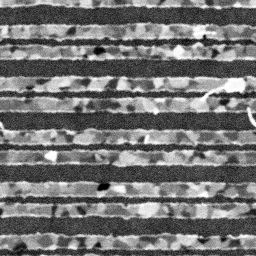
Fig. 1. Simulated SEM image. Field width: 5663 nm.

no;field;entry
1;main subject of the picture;parallel lines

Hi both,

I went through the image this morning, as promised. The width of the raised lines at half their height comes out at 290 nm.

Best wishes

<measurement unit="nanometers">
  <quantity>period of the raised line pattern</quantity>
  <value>582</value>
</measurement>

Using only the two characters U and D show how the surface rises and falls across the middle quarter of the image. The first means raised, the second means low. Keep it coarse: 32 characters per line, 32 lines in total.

DDDDDDDDDDDDDDDDDDDDDDDDDDDDDDDD
DDDDDDDDDDDDDDDDDDDDDDDDDDDDDDDD
DDDDDDDDDDDDDDDDDDDDDDDDDDDDDDDD
UUUUUUUDDDUUDUDDDDDDDDDDDDDDDDDD
UUUUUUUUUUUUUUUUUUUUUUUUUUUUUUUU
UUUUUUUUUUUUUUUUUUUUUUUUUUUUUUUU
UUUUUUDUUUDDUDDDUUUUUUUUDDUUUUUU
DDDDDDDDDDDDDDDDDDDDDDDDDDDDDDDD
DDDDDDDDDDDDDDDDDDDDDDDDDDDDDDDD
UUUUUUUUUUUUUUUUUUUUUUUUUUUUUUUU
UUUUUUUUUUUUUUUUUUUUUUUUUUUUUUUU
UUUUUUUUUUUUUUUUUUUUUUUUUUUUUUUU
DDDDDDDDDDDDDDDDDDDDDDDDDDDDDDDD
DDDDDDDDDDDDDDDDDDDDDDDDDDDDDDDD
DDDDDDDDDDDDDDDDDDDDDDDDDDDDDDDD
DDDDDDDDDDDDDDDDDDDDDDDDDDDDDDDD
DDDDDDUUDDDDDDDDDDDDDDDDDDDDDDDD
UUUUUUUUUUUUUUUUUUUUUUUUUUUUUUUU
UUUUUUUUUUUUUUUUUUUUUUUUUUUUUUUU
UUUUUUUUUUUUUUUDDUUUUUUUUUUUUUUU
DDDDDDDDDDDDDDDDDDDDDDDDDDDDDDDD
DDDDDDDDDDDDDDDDDDDDDDDDDDDDDDDD
UUUUUUUUUUUUUUUUUUUUUUUUUUUUUUUU
UUUUUUUUUUUUUUUUUUUUUUUUUUUUUUUU
UUUUUUUUUUUUUUUUUUUUUUUUUUUUUUUU
DDDDDDDDDDDDDDDDDDDDDDDDDDDDDDDD
DDDDDDDDDDDDDDDDDDDDDDDDDDDDDDDD
DDDDDDDDDDDDDDDDDDDDDDDDDDDDDDDD
DDDDDDDDDDDDDDDDDDDDDDDDDDDDDDDD
DDDDDDDDDDDDDDDDDDDDDDDDDDDDDDDD
UUUUUUUUUUUUUUUUUUUUUUUUUUUUUUUU
UUUUUUUUUUUUUUUUUUUUUUUUUUUUUUUU